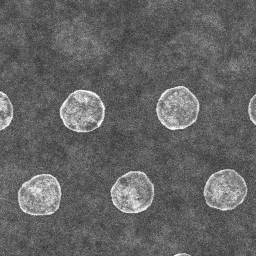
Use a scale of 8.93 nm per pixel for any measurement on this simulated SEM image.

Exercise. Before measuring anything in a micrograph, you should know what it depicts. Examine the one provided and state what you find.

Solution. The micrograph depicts raised bodies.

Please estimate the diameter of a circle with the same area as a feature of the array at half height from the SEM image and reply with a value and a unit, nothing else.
373 nm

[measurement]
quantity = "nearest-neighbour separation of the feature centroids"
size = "828 nm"